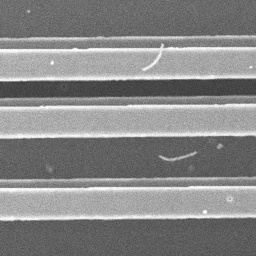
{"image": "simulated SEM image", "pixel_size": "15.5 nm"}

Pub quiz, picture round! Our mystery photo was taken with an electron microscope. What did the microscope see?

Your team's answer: lines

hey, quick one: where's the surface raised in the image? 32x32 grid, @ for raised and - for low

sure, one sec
--------------------------------
--------------------------------
--------------------------------
--------------------------------
--------------------------------
@@@@@@@@@@@@@@@@@@@@@@@@@@@@@@@@
@@@@@@@@@@@@@@@@@@@@@@@@@@@@@@@@
@@@@@@@@@@@@@@@@@@@@@@@@@@@@@@@@
@@@@@@@@@@@@@@@@@@@@@@@@@@@@@@@@
@@@@@@@@@@@@@@@@@@@@@@@@@@@@@@@@
--------------------------------
--------------------------------
@@@@@@@@@@@@@@@@@@@@@@@@@@@@@@@@
@@@@@@@@@@@@@@@@@@@@@@@@@@@@@@@@
@@@@@@@@@@@@@@@@@@@@@@@@@@@@@@@@
@@@@@@@@@@@@@@@@@@@@@@@@@@@@@@@@
@@@@@@@@@@@@@@@@@@@@@@@@@@@@@@@@
--------------------------------
--------------------------------
--------------------------------
--------------------------------
--------------------------------
--@@@@@@@@@@@@@@@@@@@@@@@@@@@@@@
@@@@@@@@@@@@@@@@@@@@@@@@@@@@@@@@
@@@@@@@@@@@@@@@@@@@@@@@@@@@@@@@@
@@@@@@@@@@@@@@@@@@@@@@@@@@@@@@@@
@@@@@@@@@@@@@@@@@@@@@@@@@@@@@@@@
--------------------------------
--------------------------------
--------------------------------
--------------------------------
--------------------------------